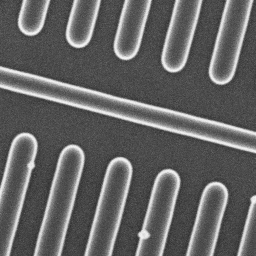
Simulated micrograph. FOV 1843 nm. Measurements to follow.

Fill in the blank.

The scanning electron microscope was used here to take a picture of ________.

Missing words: groups of lines, slits or small figures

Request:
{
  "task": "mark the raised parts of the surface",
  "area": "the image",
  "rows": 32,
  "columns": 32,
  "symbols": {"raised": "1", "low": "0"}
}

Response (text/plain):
00011100011100001110001110001110
00011100011100011100001110001110
00111000011100011100011110001110
00011000011100011100011100001110
00000000111000011100011100011100
00000000011000111000011100011100
00000000000000011000111000011100
00000000000000000000111000011100
00000000000000000000011000111000
11110000000000000000000000111000
11111111000000000000000000000000
00011111111100000000000000000000
00000001111111110000000000000000
00000000001111111110000000000000
00000000000000111111111100000000
00000000000000000011111111110000
00000000000000000000001111111110
00110000000000000000000000111111
01110000110000000000000000000011
01110000110000000000000000000000
01110001110000110000000000000000
01110001110001110000110000000000
11110001110001110000110000000000
11100011110001110001110000110000
11100011100001110001110001110000
11100011100011100001110001110001
11000011100011100011100001110001
11000011100011100011100001110001
11000111000011100011100011100001
11000111000111000111100011100011
10000111000111000111100011100011
10001111000111000111000011100011